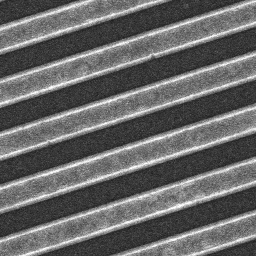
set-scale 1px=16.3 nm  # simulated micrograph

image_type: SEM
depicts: parallel lines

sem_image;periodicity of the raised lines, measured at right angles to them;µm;0.826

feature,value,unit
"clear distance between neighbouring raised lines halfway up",422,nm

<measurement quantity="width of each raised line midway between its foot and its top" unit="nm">393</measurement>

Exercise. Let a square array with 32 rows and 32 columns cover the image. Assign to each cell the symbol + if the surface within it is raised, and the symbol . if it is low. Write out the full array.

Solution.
.........++++++++++...........++
......++++++++++...........+++++
...++++++++++...........++++++++
++++++++++...........++++++++++.
+++++++..........++++++++++.....
++++..........++++++++++........
...........++++++++++...........
........++++++++++...........+++
.....++++++++++...........++++++
..++++++++++...........+++++++++
+++++++++...........++++++++++..
+++++...........++++++++++......
++...........++++++++++.........
..........++++++++++...........+
.......++++++++++...........++++
....++++++++++..........++++++++
.++++++++++..........+++++++++++
++++++++..........++++++++++....
++++...........++++++++++.......
+...........++++++++++..........
.........++++++++++...........++
......++++++++++...........+++++
..+++++++++++..........+++++++++
++++++++++..........++++++++++..
++++++...........++++++++++.....
+++...........++++++++++........
...........++++++++++...........
........++++++++++...........+++
.....+++++++++............++++++
.++++++++++...........++++++++++
+++++++++..........++++++++++...
+++++...........++++++++++......